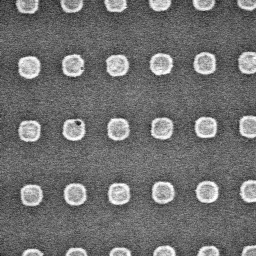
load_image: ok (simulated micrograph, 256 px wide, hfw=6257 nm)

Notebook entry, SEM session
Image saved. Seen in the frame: a regular array of raised bodies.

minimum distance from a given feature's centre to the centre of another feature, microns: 1.07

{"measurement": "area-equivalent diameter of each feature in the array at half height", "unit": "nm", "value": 493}